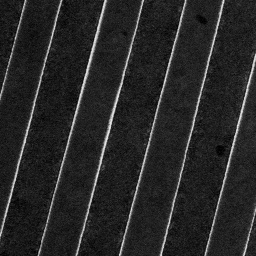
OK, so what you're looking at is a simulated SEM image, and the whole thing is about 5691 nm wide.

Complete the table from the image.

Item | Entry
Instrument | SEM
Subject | lines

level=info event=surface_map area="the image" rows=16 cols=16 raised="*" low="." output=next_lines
.***..***..***..
.**...***..***..
.**...**...**...
.**...**...**...
***..***..***...
**...***..***..*
**...**...**...*
**...**...**...*
**..***..***...*
*...**...***..**
*...**...**...**
*...**...**...**
*..***..***...**
...**...***..***
...**...**...***
..***...**...**.